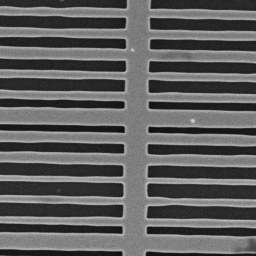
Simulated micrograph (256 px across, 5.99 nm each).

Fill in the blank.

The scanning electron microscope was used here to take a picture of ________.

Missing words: groups of lines, slits or small figures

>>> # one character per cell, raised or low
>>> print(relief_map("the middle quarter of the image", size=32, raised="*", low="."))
................*****...........
...............******...........
********************************
********************************
...............******...........
...............******...........
...............******...........
********************************
********************************
...............******...........
...............******...........
**********************..........
********************************
********************************
********************************
...............*****************
...............******...........
******************************..
********************************
..******************************
...............******...........
...............******...........
************...******...........
********************************
********************************
...............******...........
...............******...........
...............******...........
*********************...........
.....***************************
...............******...........
...............******...........